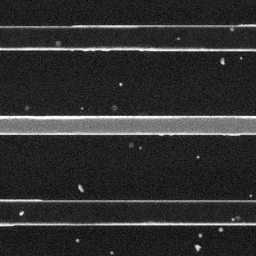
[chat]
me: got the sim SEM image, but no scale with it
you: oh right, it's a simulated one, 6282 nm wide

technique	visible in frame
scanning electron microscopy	lines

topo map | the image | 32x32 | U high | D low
DDDDDDDDDDDDDDDDDDDDDDDDDDDDDDDD
DDDDDDDDDDDDDDDDDDDDDDDDDDDDDDDD
DDDDDDDDDDDDDDDDDDDDDDDDDDDDDDDD
UUUUUUUUUUUUUUUUUUUUUUUUUUUUUUUU
UUUUUUUUUUUUUUUUUUUUUUUUUUUUUUUU
UUUUUUUUUUUUUUUUUUUUUUUUUUUUUUUU
DDDDDDDDDDDDDDDDDDDDDDDDDDDDDDDD
DDDDDDDDDDDDDDDDDDDDDDDDDDDDDDDD
DDDDDDDDDDDDDDDDDDDDDDDDDDDDDDDD
DDDDDDDDDDDDDDDDDDDDDDDDDDDDDDDD
DDDDDDDDDDDDDDDDDDDDDDDDDDDDDDDD
DDDDDDDDDDDDDDDDDDDDDDDDDDDDDDDD
DDDDDDDDDDDDDDDDDDDDDDDDDDDDDDDD
DDDDDDDDDDDDDDDDDDDDDDDDDDDDDDDD
DDDDDDDDDDDDDDDDDDDDDDDDDDDDDDDD
UUUUUUUUUUUUUUUUUUUUUUUUUUUUUUUU
UUUUUUUUUUUUUUUUUUUUUUUUUUUUUUUU
DDDDDDDDDDDDDDDDDDDDDDDDDDDDDDDD
DDDDDDDDDDDDDDDDDDDDDDDDDDDDDDDD
DDDDDDDDDDDDDDDDDDDDDDDDDDDDDDDD
DDDDDDDDDDDDDDDDDDDDDDDDDDDDDDDD
DDDDDDDDDDDDDDDDDDDDDDDDDDDDDDDD
DDDDDDDDDDDDDDDDDDDDDDDDDDDDDDDD
DDDDDDDDDDDDDDDDDDDDDDDDDDDDDDDD
DDDDDDDDDDDDDDDDDDDDDDDDDDDDDDDD
UUUUUUUUUUUUUUUUUUUUUUUUUUUUUUUU
UUUUUUUUUUUUUUUUUUUUUUUUUUUUUUUU
UUUUUUUUUUUUUUUUUUUUUUUUUUUUUUUU
DDDDDDDDDDDDDDDDDDDDDDDDDDDDDDDD
DDDDDDDDDDDDDDDDDDDDDDDDDDDDDDDD
DDDDDDDDDDDDDDDDDDDDDDDDDDDDDDDD
DDDDDDDDDDDDDDDDDDDDDDDDDDDDDDDD